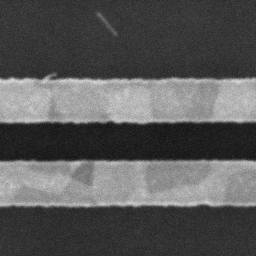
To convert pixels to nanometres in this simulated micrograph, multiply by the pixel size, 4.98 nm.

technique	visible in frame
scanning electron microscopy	lines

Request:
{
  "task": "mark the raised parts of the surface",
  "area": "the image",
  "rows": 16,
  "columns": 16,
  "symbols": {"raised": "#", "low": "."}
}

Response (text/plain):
................
................
................
................
................
################
################
################
................
................
################
################
################
................
................
................